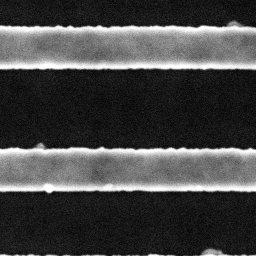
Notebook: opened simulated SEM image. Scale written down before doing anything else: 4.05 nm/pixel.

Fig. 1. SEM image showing lines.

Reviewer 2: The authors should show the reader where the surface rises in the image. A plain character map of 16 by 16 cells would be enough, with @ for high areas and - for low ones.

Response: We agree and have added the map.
----------------
----------------
@@@@@@@@@@@@@@@@
@@@@@@@@@@@@@@@@
----------------
----------------
----------------
----------------
----------------
@@@@@@@@@@@@@@@@
@@@@@@@@@@@@@@@@
@@@@@@@@@@@@@@@@
----------------
----------------
----------------
----------------